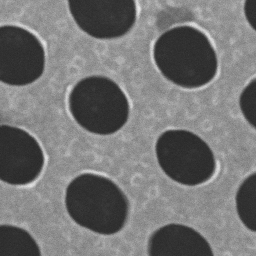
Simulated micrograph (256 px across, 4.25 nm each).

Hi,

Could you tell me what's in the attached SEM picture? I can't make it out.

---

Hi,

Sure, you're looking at holes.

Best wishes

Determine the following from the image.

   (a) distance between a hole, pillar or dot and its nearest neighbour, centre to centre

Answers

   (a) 419 nm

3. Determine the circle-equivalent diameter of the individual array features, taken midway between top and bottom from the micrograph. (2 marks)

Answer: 254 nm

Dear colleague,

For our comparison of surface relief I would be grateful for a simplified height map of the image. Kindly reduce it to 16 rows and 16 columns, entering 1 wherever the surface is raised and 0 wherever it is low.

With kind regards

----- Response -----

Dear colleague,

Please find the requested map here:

1111000011111110
1111100011111111
0011111111000111
0001111111000111
0001111111000111
1111100111111110
1111000011111110
1111100011111110
0011111111001111
0001111111000111
0001111111000111
1111000111101110
1111000011111110
1111000011111110
0011110111001111
0011111110000111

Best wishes